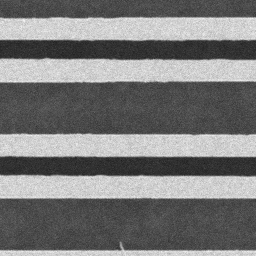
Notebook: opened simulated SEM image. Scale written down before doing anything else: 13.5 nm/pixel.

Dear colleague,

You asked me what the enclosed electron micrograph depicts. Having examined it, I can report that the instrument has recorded lines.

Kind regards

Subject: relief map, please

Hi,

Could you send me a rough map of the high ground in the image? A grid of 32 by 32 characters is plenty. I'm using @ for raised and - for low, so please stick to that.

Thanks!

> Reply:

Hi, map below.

--------------------------------
--------------------------------
@@@@@@@@@@@@@@@@@@@@@@@@@@@@@@@@
@@@@@@@@@@@@@@@@@@@@@@@@@@@@@@@@
@@@@@@@@@@@@@@@@@@@@@@@@@@@@@@@@
--------------------------------
--------------------------------
@@@@@@@@@@@@@@-----@-------@----
@@@@@@@@@@@@@@@@@@@@@@@@@@@@@@@@
@@@@@@@@@@@@@@@@@@@@@@@@@@@@@@@@
--------------------------------
--------------------------------
--------------------------------
--------------------------------
--------------------------------
--------------------------------
--------------------------------
@@@@@@@@@@@@@@@@@@@@@@@@@@@@@@@@
@@@@@@@@@@@@@@@@@@@@@@@@@@@@@@@@
@--@@@@@-@@@@@@@@@@@@@@@@@@@@@@@
--------------------------------
--------------------------------
@@@@@@@@@@@@@@@@@@@@@@@@@@@@@@@@
@@@@@@@@@@@@@@@@@@@@@@@@@@@@@@@@
@@@@@@@@@@@@@@@@@@@@@@@@@@@@@@@@
--------------------------------
--------------------------------
--------------------------------
--------------------------------
--------------------------------
--------------------------------
@@@@@@@@@@@@@@@@@@@@@@@@@@@@@@@@